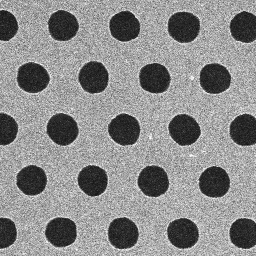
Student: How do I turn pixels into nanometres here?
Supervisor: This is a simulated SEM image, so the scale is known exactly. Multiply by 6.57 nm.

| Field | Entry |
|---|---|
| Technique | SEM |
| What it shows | a regular array of holes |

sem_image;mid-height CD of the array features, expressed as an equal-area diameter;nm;204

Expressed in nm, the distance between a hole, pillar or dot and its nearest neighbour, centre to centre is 390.